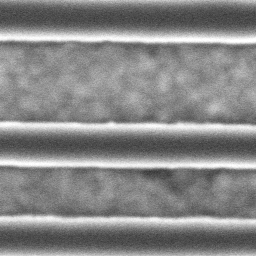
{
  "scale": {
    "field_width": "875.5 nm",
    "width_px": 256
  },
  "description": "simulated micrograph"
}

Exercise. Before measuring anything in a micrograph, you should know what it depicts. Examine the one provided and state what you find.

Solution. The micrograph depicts lines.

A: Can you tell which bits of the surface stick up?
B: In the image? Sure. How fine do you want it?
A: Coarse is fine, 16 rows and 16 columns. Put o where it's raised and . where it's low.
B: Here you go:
oooooooooooooooo
oooooooooooooooo
.....ooooooooooo
................
................
................
................
................
oooooooooooooooo
oooooooooooooooo
................
................
................
................
oooooooooooooooo
oooooooooooooooo